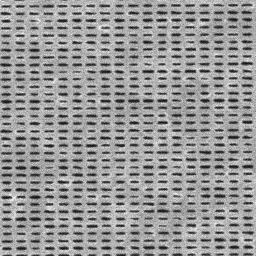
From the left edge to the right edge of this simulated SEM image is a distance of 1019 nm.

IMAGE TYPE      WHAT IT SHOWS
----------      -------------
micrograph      a regular array of holes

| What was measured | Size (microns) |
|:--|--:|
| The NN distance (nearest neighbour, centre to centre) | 0.0288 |